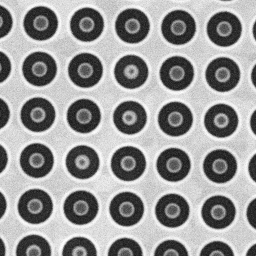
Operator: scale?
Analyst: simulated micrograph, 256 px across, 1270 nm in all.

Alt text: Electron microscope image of an array of small figures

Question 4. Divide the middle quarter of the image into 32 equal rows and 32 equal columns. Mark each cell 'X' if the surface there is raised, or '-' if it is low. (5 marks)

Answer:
X---XXX---XX---------XXX--------
X---XXX---XX----XX---XXX---XXX--
X---XXX---XX----XX---XXX--XXXX--
X---------XX---------XXX---XXX--
XX-------XXXX--------XXX--------
XXX-----XXXXXX------XXXXX------X
XXXXXXXXXXXXXXXX-XXXXXXXXX----XX
XXXXXXXXXXXXXXXXXXXXXXXXXXXXXXXX
XXXX--XXXXXXXXXXXXXXXXXXXXXXXXXX
XX------XXXXXX-----XXXXXXX----XX
X--------XXXX-------XXXXX------X
X---XX---XXX---------XXX--------
---XXXX--XXX---XX----XX----XX---
---XXXX---XX---XXX---XX---XXX---
X---XX---XXX---XX----XX---XXX---
X--------XXX--------XXXX--------
XX------XXXXX-------XXXX--------
XXXX--XXXXXXXXX----XXXXXX------X
XXXXXXXXXXXXXXXXXXXXXXXXXXX-XXXX
XXXXXXXXXXXXXXXXXXXXXXXXXXXXXXXX
XX-----XXXXXXXX---XXXXXXXXXXXXXX
X-------XXXXX------XXXXXX-----XX
X--------XXX--------XXXX-------X
----X----XXX---XX----XX----X----
---XXX---XX----XXX---XX---XXX---
---XXX---XX----XXX---XX---XXX---
X--------XXX---------XX---XXX---
X-------XXXX--------XXX--------X
XX-----XXXXXX------XXXXX-------X
XXXXXXXXXXXXXXX--XXXXXXXXX---XXX
XXXXXXXXXXXXXXXXXXXXXXXXXXXXXXXX
XXX---XXXXXXXXXXXXXXXXXXXXXXXXXX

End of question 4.